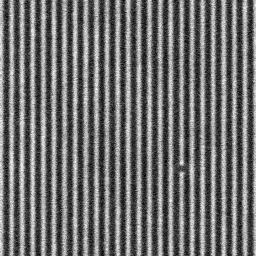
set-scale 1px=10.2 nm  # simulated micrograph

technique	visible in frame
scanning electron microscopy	parallel lines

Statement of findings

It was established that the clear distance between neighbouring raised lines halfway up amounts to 6.87 pixels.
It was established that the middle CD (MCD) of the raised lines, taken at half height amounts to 34.4 nm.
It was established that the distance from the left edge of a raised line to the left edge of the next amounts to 108 nm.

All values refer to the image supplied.